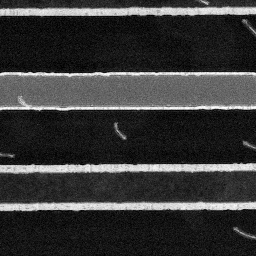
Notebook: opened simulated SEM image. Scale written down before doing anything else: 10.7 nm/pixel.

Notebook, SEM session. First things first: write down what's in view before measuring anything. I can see lines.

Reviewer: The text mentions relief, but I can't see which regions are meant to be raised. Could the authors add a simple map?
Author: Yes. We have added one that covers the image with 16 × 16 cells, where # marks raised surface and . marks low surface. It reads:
################
................
................
................
................
################
################
................
................
................
......##########
################
################
................
................
................